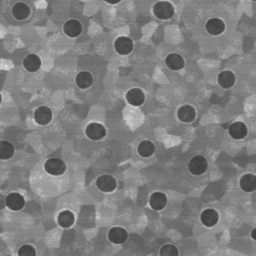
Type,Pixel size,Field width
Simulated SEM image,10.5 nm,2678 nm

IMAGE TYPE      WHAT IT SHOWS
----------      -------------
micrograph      a regular array of holes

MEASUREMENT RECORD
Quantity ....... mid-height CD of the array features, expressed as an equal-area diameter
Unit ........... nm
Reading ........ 201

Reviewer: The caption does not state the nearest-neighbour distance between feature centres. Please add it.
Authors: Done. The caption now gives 553 nm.